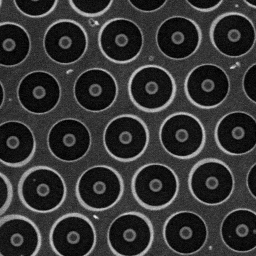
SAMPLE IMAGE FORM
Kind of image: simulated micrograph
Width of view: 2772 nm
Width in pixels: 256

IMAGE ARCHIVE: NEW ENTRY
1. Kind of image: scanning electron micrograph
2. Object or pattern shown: an array of small figures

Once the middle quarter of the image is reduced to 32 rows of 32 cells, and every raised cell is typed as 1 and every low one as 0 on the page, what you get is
11111111111111111111111111111111
11111110001111111110000001111111
11111000000111111100000000111110
11110000000011111000000000011110
11100000000001111000000000011110
11100001100001110000011000001100
11100001100001110000011000011100
11100001100001111000000000011110
11100000000001111000000000011110
11110000000011111100000000111111
11110000000111111110000001111111
11111100001111111111000111111111
11111111111111111111111111111011
11111111111110000011111111000000
00001111111100000001111110000000
00000111111000000000111110000000
00000011110000000000011100000000
00000011110000110000011100001110
11100011110000111000011100001110
11100001110000010000011100000000
00000011111000000000111110000000
00000011111000000000111111000000
00000111111100000001111111100000
00001111111110000111111111111111
11111111111111111111111111111111
11111111111111111111100001111111
11111100000011111110000000011111
11111000000001111100000000001111
11110000000000111100000000001111
11110000000000111000001100001110
11100000110000111000001100001110
11100000110000111000001100001111